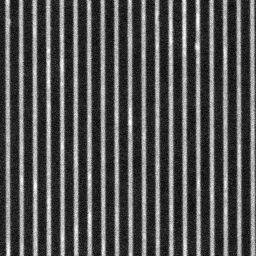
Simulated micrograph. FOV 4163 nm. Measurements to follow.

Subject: parallel lines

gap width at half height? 0.167 microns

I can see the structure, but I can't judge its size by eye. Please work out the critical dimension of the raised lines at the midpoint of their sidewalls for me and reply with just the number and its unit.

54.9 nanometers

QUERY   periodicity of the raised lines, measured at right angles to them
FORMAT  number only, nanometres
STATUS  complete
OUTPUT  221